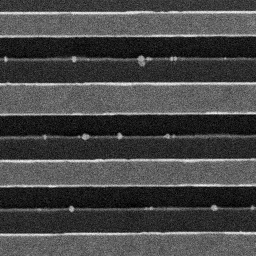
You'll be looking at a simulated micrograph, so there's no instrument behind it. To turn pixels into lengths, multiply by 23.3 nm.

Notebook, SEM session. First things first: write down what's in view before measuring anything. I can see lines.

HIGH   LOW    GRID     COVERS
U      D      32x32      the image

DDDDDDDDDDDDDDDDDDDDDDDDDDDDDDDD
DDDDDDDDDDDDDDDDUUUDDUUUUUUUUUUU
UUUUUUUUUUUUUUUUUUUUUUUUUUUUUUUU
UUUUUUUUUUUUUUUUUUUUUUUUUUUUUUUU
UUUUUUUUUUUUUUUUUUUUUUDUUDDDDDDD
DDDDDDDDDDDDDDDDDDDDDDDDDDDDDDDD
DDDDDDDDDDDDDDDDDDDDDDDDDDDDDDDD
DDDDDDDDDDDDDDDDDDDDDDDDDDDDDDDD
DDDDDDDDDDDDDDDDDDDDDDDDDDDDDDDD
DDDDDDDDDDDDDDDDDDDDDDDDDDDDDDDD
UUUUUUUUUUUUUUUUUUUUUUUUUUUUUUUU
UUUUUUUUUUUUUUUUUUUUUUUUUUUUUUUU
UUUUUUUUUUUUUUUUUUUUUUUUUUUUUUUU
UUUUUUUUUUUUUUUUUUUUUUUUUUUUUUUU
DDDDDDDDDDDDDDDDDDDDDDDDDDDDDDDD
DDDDDDDDDDDDDDDDDDDDDDDDDDDDDDDD
DDDDDDDDDDDDDDDDDDDDDDDDDDDDDDDD
DDDDDDDDDDDDDDDDDDDDDDDDDDDDDDDD
DDDDDDDDDDDDDDDDDDDDDDDDDDDDDDDD
DDDDDDDDDDDDDDDDDDDDDDDDDDDDDDDD
UUUUUUUUUUUUUUUUUUUUUUUUUUUUUUUU
UUUUUUUUUUUUUUUUUUUUUUUUUUUUUUUU
UUUUUUUUUUUUUUUUUUUUUUUUUUUUUUUU
DDDDDDDDDDDDDDDDDDDDDDDDDDDDDDDD
DDDDDDDDDDDDDDDDDDDDDDDDDDDDDDDD
DDDDDDDDDDDDDDDDDDDDDDDDDDDDDDDD
DDDDDDDDDDDDDDDDDDDDDDDDDDDDDDDD
DDDDDDDDDDDDDDDDDDDDDDDDDDDDDDDD
DDDDDDDDDDDDDDDDDDDDDDDDDDDDDDDD
UUUUUUUUUUUUUUUUUUUUUUUUUUUUUUUU
UUUUUUUUUUUUUUUUUUUUUUUUUUUUUUUU
UUUUUUUUUUUUUUUUUUUUUUUUUUUUUUUU